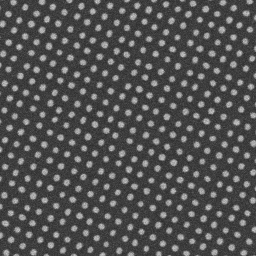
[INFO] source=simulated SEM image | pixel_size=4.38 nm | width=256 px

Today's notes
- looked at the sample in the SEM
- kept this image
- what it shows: a regular array of raised bodies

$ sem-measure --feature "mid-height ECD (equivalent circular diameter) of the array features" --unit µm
0.0271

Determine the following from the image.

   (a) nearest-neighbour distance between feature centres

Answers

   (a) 51.5 nm